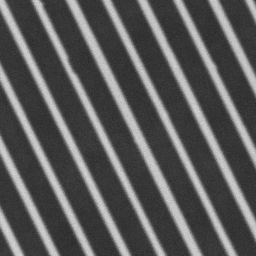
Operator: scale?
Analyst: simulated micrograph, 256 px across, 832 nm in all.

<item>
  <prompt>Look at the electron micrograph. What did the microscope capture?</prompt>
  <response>parallel lines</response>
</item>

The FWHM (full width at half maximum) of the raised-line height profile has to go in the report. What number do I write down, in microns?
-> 0.023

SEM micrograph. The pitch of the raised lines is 0.104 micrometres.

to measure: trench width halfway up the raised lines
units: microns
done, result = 0.0802